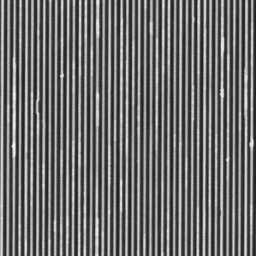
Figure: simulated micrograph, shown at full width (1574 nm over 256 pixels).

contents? parallel lines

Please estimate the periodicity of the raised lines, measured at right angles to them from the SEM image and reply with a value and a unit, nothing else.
5.93 pixels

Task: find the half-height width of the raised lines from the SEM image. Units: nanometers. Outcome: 16.1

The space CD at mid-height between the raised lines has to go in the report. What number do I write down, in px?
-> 3.63